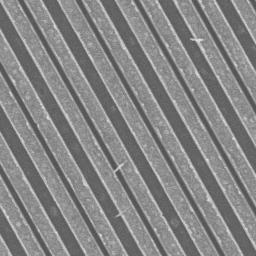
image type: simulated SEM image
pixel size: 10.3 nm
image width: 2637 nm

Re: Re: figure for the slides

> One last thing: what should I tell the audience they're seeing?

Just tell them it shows parallel lines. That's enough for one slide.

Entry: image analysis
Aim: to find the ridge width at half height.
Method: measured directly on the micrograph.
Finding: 151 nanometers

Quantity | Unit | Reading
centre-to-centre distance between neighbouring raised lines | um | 0.258